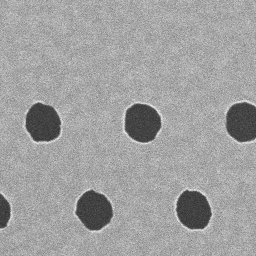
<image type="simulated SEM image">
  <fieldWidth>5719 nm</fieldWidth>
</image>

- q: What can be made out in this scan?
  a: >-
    holes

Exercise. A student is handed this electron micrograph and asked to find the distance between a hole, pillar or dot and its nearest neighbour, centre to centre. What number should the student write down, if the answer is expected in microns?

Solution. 2.22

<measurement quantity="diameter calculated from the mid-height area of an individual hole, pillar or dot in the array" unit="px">37.8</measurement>